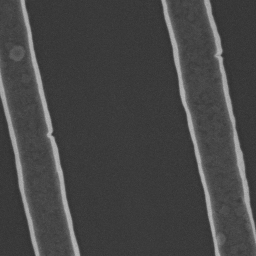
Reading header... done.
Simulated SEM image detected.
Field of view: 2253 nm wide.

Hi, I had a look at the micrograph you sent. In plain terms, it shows one or a few lines or trenches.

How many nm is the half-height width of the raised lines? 351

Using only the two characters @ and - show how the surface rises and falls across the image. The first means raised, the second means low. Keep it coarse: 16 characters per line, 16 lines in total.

@---------@@@---
@@---------@@---
@@---------@@@--
@@---------@@@--
@@---------@@@--
@@@--------@@@--
@@@---------@@--
-@@---------@@@-
-@@---------@@@-
-@@---------@@@-
-@@@---------@@-
-@@@---------@@-
--@@---------@@-
--@@---------@@@
--@@@--------@@@
--@@@---------@@